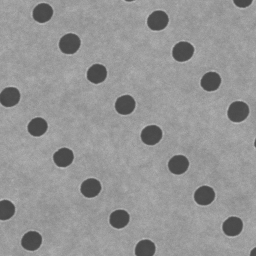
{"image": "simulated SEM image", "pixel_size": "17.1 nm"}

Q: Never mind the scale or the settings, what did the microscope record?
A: a regular array of holes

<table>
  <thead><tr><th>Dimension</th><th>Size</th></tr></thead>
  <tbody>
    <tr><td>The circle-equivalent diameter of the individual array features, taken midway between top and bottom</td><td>359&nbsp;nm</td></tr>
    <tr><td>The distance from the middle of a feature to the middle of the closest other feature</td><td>0.696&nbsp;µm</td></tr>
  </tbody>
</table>